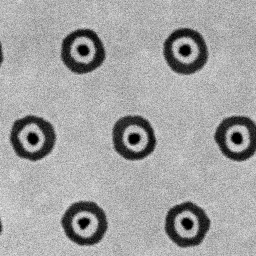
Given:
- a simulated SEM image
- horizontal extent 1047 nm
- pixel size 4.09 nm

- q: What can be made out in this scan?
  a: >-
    ring-shaped grooves with a dot in the middle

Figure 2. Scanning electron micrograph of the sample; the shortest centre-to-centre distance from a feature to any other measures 0.405 micrometres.